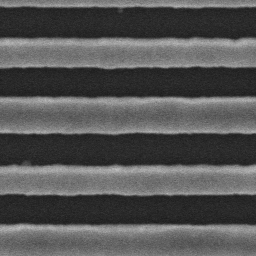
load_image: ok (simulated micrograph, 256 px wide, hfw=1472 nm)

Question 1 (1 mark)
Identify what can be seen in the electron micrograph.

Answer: lines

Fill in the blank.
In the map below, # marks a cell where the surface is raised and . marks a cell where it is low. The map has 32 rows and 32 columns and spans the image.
################################
................................
................................
................................
................................
################################
################################
################################
.............##.................
................................
................................
................................
################################
################################
################################
################################
################################
................................
................................
................................
................................
################################
################################
################################
................................
................................
................................
................................
################################
################################
################################
################################